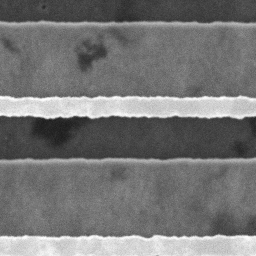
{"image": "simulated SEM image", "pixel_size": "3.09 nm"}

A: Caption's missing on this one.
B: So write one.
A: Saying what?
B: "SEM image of lines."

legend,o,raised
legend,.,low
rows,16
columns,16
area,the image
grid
................
oooooooooooooooo
oooooooooooooooo
oooooooooooooooo
oooooooooooooooo
oooooooooooooooo
oooooooooooooooo
................
................
................
oooooooooooooooo
oooooooooooooooo
oooooooooooooooo
oooooooooooooooo
oooooooooooooooo
oooooooooooooooo